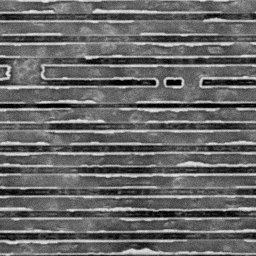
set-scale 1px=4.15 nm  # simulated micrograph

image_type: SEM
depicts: parallel lines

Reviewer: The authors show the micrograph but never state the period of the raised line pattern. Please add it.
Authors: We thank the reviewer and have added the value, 0.0912 microns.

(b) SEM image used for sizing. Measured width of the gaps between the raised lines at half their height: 0.028 microns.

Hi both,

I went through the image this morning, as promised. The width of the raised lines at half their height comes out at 63.8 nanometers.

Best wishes